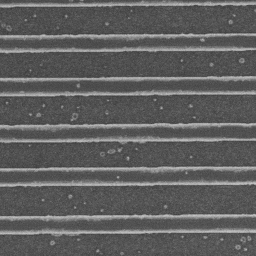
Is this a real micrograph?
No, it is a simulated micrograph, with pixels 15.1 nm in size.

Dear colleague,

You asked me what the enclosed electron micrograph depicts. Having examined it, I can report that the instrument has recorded lines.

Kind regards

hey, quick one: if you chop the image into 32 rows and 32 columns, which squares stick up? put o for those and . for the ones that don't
oooooooooooooooooooooooooooooooo
................................
................................
................................
o..ooooooooooooooooooooooooooooo
oooooooooooooooooooooooooooooooo
................................
................................
................................
................................
oooooooooooooooooooooooooooooooo
oooooooooooooooooooooooooooooooo
................................
................................
................................
..........................oooooo
oooooooooooooooooooooooooooooooo
oooooooooooooooo.o..oo..........
................................
................................
................................
oooooooooooooooooooooooooooooooo
oooooooooooooooooooooooooooooooo
................................
................................
................................
................................
oooooooooooooooooooooooooooooooo
oooooooooooooooooooooooooooooooo
................................
................................
................................